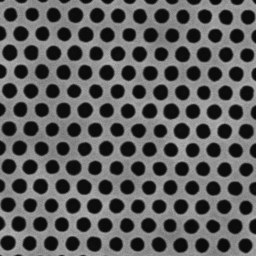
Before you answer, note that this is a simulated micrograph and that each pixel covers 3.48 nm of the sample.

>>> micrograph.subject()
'a regular array of holes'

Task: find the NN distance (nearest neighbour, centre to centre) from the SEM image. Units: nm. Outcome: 74.4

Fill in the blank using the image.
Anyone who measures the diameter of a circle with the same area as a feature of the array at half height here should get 14.2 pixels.